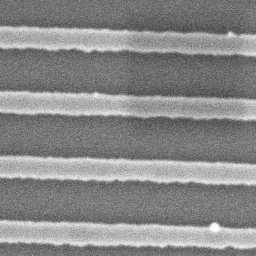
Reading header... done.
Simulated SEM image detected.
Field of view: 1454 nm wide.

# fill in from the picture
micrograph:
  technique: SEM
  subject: lines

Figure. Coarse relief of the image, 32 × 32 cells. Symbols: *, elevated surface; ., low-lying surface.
................................
................................
................................
****............................
********************************
********************************
.................**.************
................................
................................
................................
................................
................................
*******************************.
********************************
.................***************
................................
................................
................................
................................
................................
**************************.*....
********************************
..........*.**.*.***************
................................
................................
................................
................................
................................
*************************.**....
********************************
.......*.***********************
................................